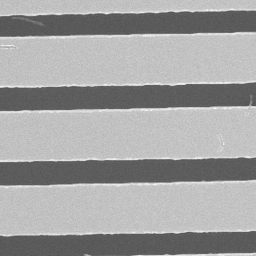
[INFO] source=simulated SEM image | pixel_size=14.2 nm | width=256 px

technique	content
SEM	lines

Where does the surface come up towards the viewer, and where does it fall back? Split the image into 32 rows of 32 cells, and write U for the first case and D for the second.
UUUUUUUUUUUUUUUUUUUUUUUUUUUUUUUU
UUUUUUUUUUUUUUUUUUUUDDDDDDDDDDDD
DDDDDDDDDDDDDDDDDDDDDDDDDDDDDDDD
DDDDDDDDDDDDDDDDDDDDDDDDDDDDDDDD
DDDDDDDDDUUUUUUUUUUUUUUUUUUUUUUU
UUUUUUUUUUUUUUUUUUUUUUUUUUUUUUUU
UUUUUUUUUUUUUUUUUUUUUUUUUUUUUUUU
UUUUUUUUUUUUUUUUUUUUUUUUUUUUUUUU
UUUUUUUUUUUUUUUUUUUUUUUUUUUUUUUU
UUUUUUUUUUUUUUUUUUUUUUUUUUUUUUUU
UUUUUUUUUUUUUUUUUUUUUUUUDDDDDDDD
DDDDDDDDDDDDDDDDDDDDDDDDDDDDDDDD
DDDDDDDDDDDDDDDDDDDDDDDDDDDDDDDD
DDDDDDDDDDDDDDDDDDDDDUUUUUUUUUUU
UUUUUUUUUUUUUUUUUUUUUUUUUUUUUUUU
UUUUUUUUUUUUUUUUUUUUUUUUUUUUUUUU
UUUUUUUUUUUUUUUUUUUUUUUUUUUUUUUU
UUUUUUUUUUUUUUUUUUUUUUUUUUUUUUUU
UUUUUUUUUUUUUUUUUUUUUUUUUUUUUUUU
UUUUUUUUUUUUUUUUUUUUUUUUUUUUUUUU
DDDDDDDDDDDDDDDDDDDDDDDDDDDDDDDD
DDDDDDDDDDDDDDDDDDDDDDDDDDDDDDDD
DDDDDDDDDDDDDDDDDDDDDDDDDDDDDDDD
UUUUUUUUUUUUUUUUUUUUUUUUUUUUUUUU
UUUUUUUUUUUUUUUUUUUUUUUUUUUUUUUU
UUUUUUUUUUUUUUUUUUUUUUUUUUUUUUUU
UUUUUUUUUUUUUUUUUUUUUUUUUUUUUUUU
UUUUUUUUUUUUUUUUUUUUUUUUUUUUUUUU
UUUUUUUUUUUUUUUUUUUUUUUUUUUUUUUU
DDDDDDDDDDDDDDDDDDDDDDDDDDDDDDDD
DDDDDDDDDDDDDDDDDDDDDDDDDDDDDDDD
DDDDDDDDDDDDDDDDDDDDDDDDDDDDDDDD